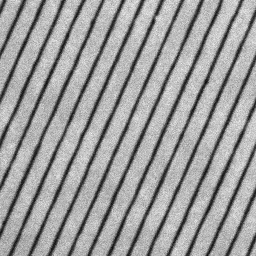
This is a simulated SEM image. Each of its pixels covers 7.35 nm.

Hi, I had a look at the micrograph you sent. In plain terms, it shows parallel lines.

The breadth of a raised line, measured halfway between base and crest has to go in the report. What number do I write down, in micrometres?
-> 0.102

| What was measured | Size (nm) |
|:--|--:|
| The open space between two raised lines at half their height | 29.4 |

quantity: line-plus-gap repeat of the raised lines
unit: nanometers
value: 133